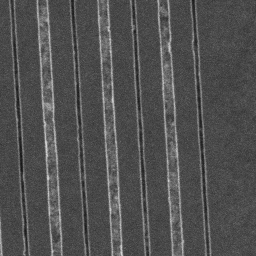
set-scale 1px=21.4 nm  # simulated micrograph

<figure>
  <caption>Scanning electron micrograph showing parallel lines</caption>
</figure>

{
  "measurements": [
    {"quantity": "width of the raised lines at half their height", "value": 492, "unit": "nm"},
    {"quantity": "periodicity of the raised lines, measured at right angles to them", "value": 659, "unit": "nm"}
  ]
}